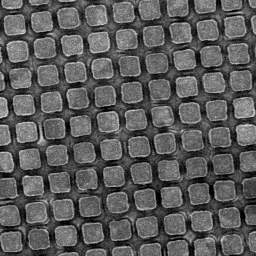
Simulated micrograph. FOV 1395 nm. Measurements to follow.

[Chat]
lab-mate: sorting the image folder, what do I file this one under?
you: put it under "a regular array of raised bodies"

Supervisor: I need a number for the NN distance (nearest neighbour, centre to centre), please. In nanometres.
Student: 145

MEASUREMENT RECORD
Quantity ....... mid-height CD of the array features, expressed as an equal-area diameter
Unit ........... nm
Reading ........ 121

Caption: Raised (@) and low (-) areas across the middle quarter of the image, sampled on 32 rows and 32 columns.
@@@@@--@@@@@--@@@@@--@@@@@--@@@@
@@@@@--@@@@@--@@@@@--@@@@@------
@@@@@--@@@@@--@@@@@-------------
-@@@@---@-@------------------@@@
-@--------------------@@@@--@@@@
---------------@@@@--@@@@@--@@@@
-@@@@---@@@@--@@@@@--@@@@@@-@@@@
-@@@@@--@@@@@--@@@@@--@@@@@-@@@@
-@@@@@--@@@@@--@@@@@--@@@@------
-@@@@@--@@@@@--@@@--------------
-@@@@@--@@-------------------@@@
-----------------@-@--@@@@@--@@@
---------@@@@--@@@@@--@@@@@--@@@
--@@@@--@@@@@--@@@@@--@@@@@--@@@
--@@@@@--@@@@@--@@@@@-@@@@@---@@
--@@@@@--@@@@@--@@@@@--@@-------
--@@@@@--@@@@---@---------------
--@@@@------------------@@@---@@
-----------------@@@---@@@@@--@@
---------@@@@@--@@@@@--@@@@@--@@
---@@@@--@@@@@--@@@@@--@@@@@--@@
@--@@@@@-@@@@@--@@@@@--@@@@@--@@
@--@@@@@-@@@@@--@@@@@-----------
@--@@@@@--@@@@------------------
@--@@@------------------@@@@---@
-----------------@@@@@--@@@@@--@
------@@--@@@@@--@@@@@--@@@@@--@
@--@@@@@--@@@@@--@@@@@--@@@@@--@
@--@@@@@--@@@@@--@@@@@--@@@@@---
@--@@@@@--@@@@@---@@@-----------
@@-@@@@@---@@------------------@
@-------------------@@--@@@@@--@